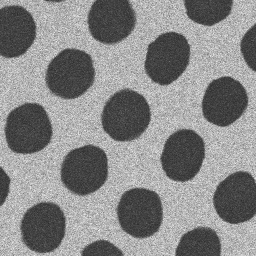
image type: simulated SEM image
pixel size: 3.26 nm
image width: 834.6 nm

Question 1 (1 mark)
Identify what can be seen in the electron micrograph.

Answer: a regular array of holes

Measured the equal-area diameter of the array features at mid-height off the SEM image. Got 157 nm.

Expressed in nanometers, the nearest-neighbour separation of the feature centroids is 227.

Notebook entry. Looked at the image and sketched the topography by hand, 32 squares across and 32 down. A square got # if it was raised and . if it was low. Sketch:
############....#######......###
....#######......######......###
....#######......#######....####
....#######......##############.
....########....####...#######..
....###############.....######..
...#####...#######......######..
#######....#######......#######.
######......######.....########.
######......#######....#########
######.....#########.#####....##
######.....####..#########.....#
##############....#######......#
##...########......######......#
#.....#######......#######....##
#.....#######......########..###
#......######.....####..########
#.....########...####....#######
#....#####...#######......######
########.....#######......######
########.....#######.....#######
.#######.....########....#####.#
.#######.....#########..####....
.#######....###############.....
.##############.....#######.....
#####..########.....#######.....
###.....#######.....#######.....
###.....#######.....########...#
###.....#######.....#####.######
###.....#########..####....#####
###.....###...########......####
####..####.....#######......####